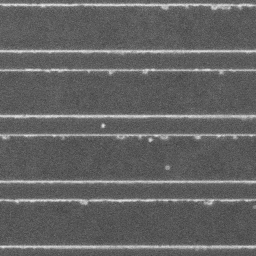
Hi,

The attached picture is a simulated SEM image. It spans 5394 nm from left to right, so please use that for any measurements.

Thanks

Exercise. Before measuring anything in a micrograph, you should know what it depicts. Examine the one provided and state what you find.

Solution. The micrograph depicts lines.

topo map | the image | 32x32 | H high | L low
HHHHHHHHHHHHHHHHHHHHHHHHHHHHHHHH
LLLLLLLLLLLLLLLLLLLLLLLLLLLLLLLL
LLLLLLLLLLLLLLLLLLLLLLLLLLLLLLLL
LLLLLLLLLLLLLLLLLLLLLLLLLLLLLLLL
LLLLLLLLLLLLLLLLLLLLLLLLLLLLLLLL
LLLLLLLLLLLLLLLLLLLLLLLLLLLLLLLL
HHHHHHHHHHHHHHHHHHHHHHHHHHHHHHHH
HHHHHHHHHHHHHHHHHHHHHHHHHHHHHHHH
HHHHHHHHHHHHHHHHHHHHHHHHHHHHHHHH
LLLLLLLLLLLLLLLLLLLLLLLLLLLLLLLL
LLLLLLLLLLLLLLLLLLLLLLLLLLLLLLLL
LLLLLLLLLLLLLLLLLLLLLLLLLLLLLLLL
LLLLLLLLLLLLLLLLLLLLLLLLLLLLLLLL
LLLLLLLLLLLLLLLLLLLLLLLLLLLLLLLL
LLHHHHLHHLLHHHLLHHHHHLLHHHLHHHHH
HHHHHHHHHHHHHHHHHHHHHHHHHHHHHHHH
HHHHHHHHHHHHHHHHHHHHHHHHHHHHHHHH
LLLLLLLLLLLLLLLLLLLLLLLLLLLLLLLL
LLLLLLLLLLLLLLLLLLLLLLLLLLLLLLLL
LLLLLLLLLLLLLLLLLLLLLLLLLLLLLLLL
LLLLLLLLLLLLLLLLLLLLLLLLLLLLLLLL
LLLLLLLLLLLLLLLLLLLLLLLLLLLLLLLL
LLLLLLLLLLLLLLLLLLLLLLLLLLLLLLLL
HHHHHHHHHHHHHHHHHHHHHHHHHHHHHHHH
HHHHHHHHHHHHHHHHHHHHHHHHHHHHHHHH
LLLLLLLLLLLLLLLLLLLLLLLLLLLLLLLL
LLLLLLLLLLLLLLLLLLLLLLLLLLLLLLLL
LLLLLLLLLLLLLLLLLLLLLLLLLLLLLLLL
LLLLLLLLLLLLLLLLLLLLLLLLLLLLLLLL
LLLLLLLLLLLLLLLLLLLLLLLLLLLLLLLL
LLLLLLLLLLLLLLLLLLLLLLLLLLLLLLLL
HHHHHHHHHHHHHHHHHHHHHHHHHHHHHHHH